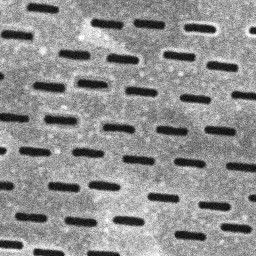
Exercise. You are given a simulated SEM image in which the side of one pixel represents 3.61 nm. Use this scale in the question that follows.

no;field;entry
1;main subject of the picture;a regular array of holes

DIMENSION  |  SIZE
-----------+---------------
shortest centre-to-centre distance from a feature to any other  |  134 nanometers